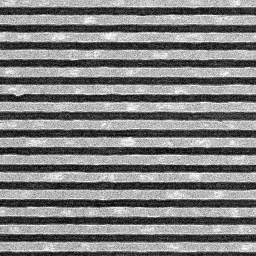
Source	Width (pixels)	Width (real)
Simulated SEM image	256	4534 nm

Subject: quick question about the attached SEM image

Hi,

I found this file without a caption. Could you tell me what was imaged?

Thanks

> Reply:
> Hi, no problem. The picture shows parallel lines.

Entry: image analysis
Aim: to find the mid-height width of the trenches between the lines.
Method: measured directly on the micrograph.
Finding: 135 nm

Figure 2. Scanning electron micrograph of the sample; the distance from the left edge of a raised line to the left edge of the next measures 309 nm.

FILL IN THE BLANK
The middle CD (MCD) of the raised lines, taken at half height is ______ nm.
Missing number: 166